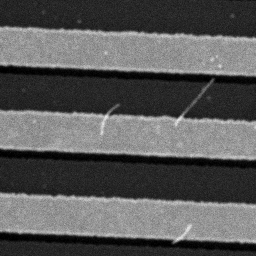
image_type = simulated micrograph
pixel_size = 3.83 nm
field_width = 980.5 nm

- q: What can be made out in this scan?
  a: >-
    lines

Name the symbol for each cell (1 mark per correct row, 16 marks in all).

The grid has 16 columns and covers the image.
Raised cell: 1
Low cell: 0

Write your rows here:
0000000000000000
0000000000000000
1111111111111111
1111111111111111
0000000001111111
0000000000000000
0000000000000000
1111111111111100
1111111111111111
0000111111111111
0000000000000000
0000000000000000
1111111111000000
1111111111111111
1111111111111111
0000000000000000